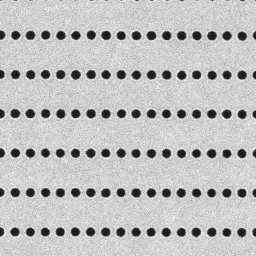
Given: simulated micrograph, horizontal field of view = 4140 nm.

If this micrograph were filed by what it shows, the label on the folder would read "a regular array of holes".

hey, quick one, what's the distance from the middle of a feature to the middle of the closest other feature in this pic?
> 15 pixels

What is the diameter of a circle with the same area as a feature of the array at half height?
0.155 microns